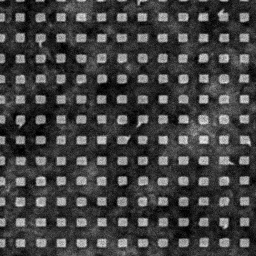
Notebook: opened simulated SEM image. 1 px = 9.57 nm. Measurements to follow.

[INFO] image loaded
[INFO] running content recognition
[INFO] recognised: a regular array of raised bodies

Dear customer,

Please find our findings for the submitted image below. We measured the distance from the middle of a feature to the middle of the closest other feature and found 191 nanometres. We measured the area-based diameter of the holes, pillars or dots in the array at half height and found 9.57 pixels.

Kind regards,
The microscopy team